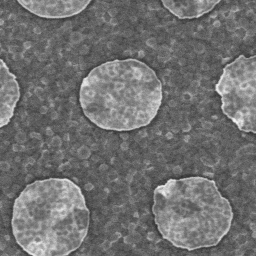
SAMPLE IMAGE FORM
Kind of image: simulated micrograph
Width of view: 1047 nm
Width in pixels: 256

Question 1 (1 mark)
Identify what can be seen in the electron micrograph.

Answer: raised bodies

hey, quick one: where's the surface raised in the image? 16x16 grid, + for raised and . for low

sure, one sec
..+++.....+++...
................
................
................
+.....++++....++
+....+++++....++
+....+++++....++
+.....+++......+
................
................
................
..+++.....+++...
.++++.....++++..
.+++++....++++..
.++++.....++++..
.++++...........